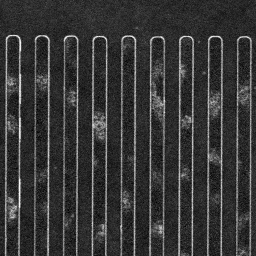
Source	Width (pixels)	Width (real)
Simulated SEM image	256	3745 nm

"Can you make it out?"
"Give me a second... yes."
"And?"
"parallel lines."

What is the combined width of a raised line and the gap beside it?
422 nanometres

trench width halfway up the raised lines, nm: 223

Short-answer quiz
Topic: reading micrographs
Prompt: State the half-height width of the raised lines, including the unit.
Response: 201 nm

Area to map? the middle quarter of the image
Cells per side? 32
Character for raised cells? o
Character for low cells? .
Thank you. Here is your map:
ooo....oooo....ooo....ooo....ooo
ooo....oooo....ooo....ooo....ooo
ooo....oooo....ooo....ooo....ooo
ooo....oooo....ooo....ooo....ooo
ooo....oooo....ooo....ooo....ooo
ooo....oooo....ooo....ooo....ooo
ooo....oooo....ooo....ooo....ooo
ooo....oooo....ooo....ooo....ooo
ooo....oooo....ooo....ooo....ooo
ooo....oooo....ooo....ooo....ooo
ooo....oooo....ooo....ooo....ooo
ooo....oooo....ooo....ooo....ooo
ooo....oooo....ooo....ooo....ooo
ooo....oooo....ooo....ooo....ooo
ooo....oooo...oooo....ooo....ooo
ooo....oooo...oooo....ooo....ooo
ooo....oooo...oooo....ooo....ooo
ooo....oooo...oooo....ooo....ooo
ooo....oooo...oooo....ooo....ooo
ooo....oooo...oooo....ooo....ooo
ooo....oooo...oooo....ooo....ooo
ooo....oooo...oooo....ooo....ooo
ooo....oooo...oooo....ooo....ooo
ooo....oooo...oooo....ooo....ooo
ooo....oooo...oooo....ooo....ooo
ooo....oooo...oooo....ooo....ooo
ooo....oooo...oooo....ooo....ooo
ooo....oooo...oooo....ooo....ooo
ooo....oooo...oooo....ooo....ooo
ooo....oooo...oooo....ooo....ooo
ooo....oooo...oooo....ooo....ooo
ooo....oooo...oooo....ooo....ooo